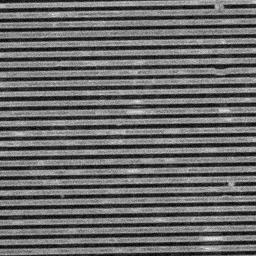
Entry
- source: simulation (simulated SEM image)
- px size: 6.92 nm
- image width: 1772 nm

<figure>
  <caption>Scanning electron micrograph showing parallel lines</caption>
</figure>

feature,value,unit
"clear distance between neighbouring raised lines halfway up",34.6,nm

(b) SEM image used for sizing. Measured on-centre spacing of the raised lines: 68.1 nm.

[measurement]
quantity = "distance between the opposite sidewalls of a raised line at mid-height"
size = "0.0346 microns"